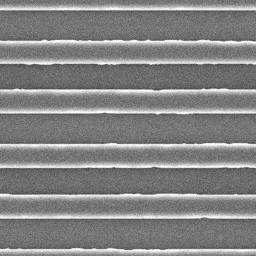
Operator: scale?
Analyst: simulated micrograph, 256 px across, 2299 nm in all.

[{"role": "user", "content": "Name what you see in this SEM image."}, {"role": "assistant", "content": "lines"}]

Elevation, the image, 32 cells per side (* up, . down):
********************************
................................
................................
................................
................................
********************************
********************************
********************************
................................
................................
................................
********************************
********************************
********************************
................................
................................
................................
................................
********************************
********************************
********************************
................................
................................
................................
********************************
********************************
********************************
................................
................................
................................
................................
********************************